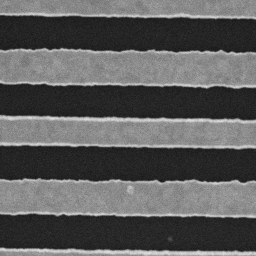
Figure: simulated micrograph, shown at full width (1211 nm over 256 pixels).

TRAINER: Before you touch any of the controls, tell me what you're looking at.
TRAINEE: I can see lines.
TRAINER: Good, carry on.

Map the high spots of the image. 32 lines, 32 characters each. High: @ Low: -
@@@@@@@@@@@@@@@@@@@@@@@@@@@@@@@@
@@@@@@@@@@@@@@@@@@@@@@@@@@@@@@@@
--------------------------------
--------------------------------
--------------------------------
--------------------------------
@@@@@@@@@@@@@@-@@@@@@---@--@----
@@@@@@@@@@@@@@@@@@@@@@@@@@@@@@@@
@@@@@@@@@@@@@@@@@@@@@@@@@@@@@@@@
@@@@@@@@@@@@@@@@@@@@@@@@@@@@@@@@
------@@@@@@@@@@@@@@@@@@@@@@@@@@
--------------------------------
--------------------------------
--------------------------------
--------------------------------
@@@@@@@@@@@@@@@@@@@@@@@@@@@@@@@@
@@@@@@@@@@@@@@@@@@@@@@@@@@@@@@@@
@@@@@@@@@@@@@@@@@@@@@@@@@@@@@@@@
-----------------------------@--
--------------------------------
--------------------------------
--------------------------------
@--@@@@-@-----------------------
@@@@@@@@@@@@@@@@@@@@@@@@@@@@@@@@
@@@@@@@@@@@@@@@@@@@@@@@@@@@@@@@@
@@@@@@@@@@@@@@@@@@@@@@@@@@@@@@@@
@@@@@@@@@@@@@@@@@@@@@@@@@@@@@@@@
--------------------------------
--------------------------------
--------------------------------
--------------------------------
@@@@@@@@@@@@@@@@@@@@@@@@@@-@-@--